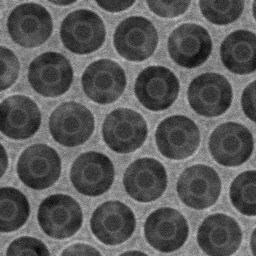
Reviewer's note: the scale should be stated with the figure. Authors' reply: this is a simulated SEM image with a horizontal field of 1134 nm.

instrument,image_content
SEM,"an array of small figures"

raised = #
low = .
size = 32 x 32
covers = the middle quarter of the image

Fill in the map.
..####........#######....####...
..###..........####........#####
..##...........####.........####
..##............##..........####
..##............##...........###
..##............#............##.
.####..........##............##.
#####..........###...........##.
######........####..........###.
...####......######.........###.
.....##############........####.
.......#####......###....#######
.......####........#############
........##..........#####.......
........##...........###........
........#............##.........
........#............##.........
.......##............##.........
.......###...........#..........
......####..........###.........
....#######........####.........
############......#####.........
####......####..########........
###........########....##......#
##..........#####.......########
##..........####.........######.
#............##...........####..
#............##...........###...
#............##...........##....
##..........###...........##....
##..........###...........##....
###........####..........###....